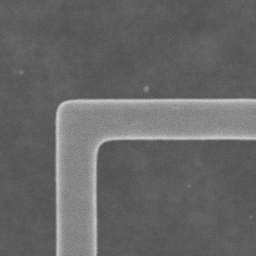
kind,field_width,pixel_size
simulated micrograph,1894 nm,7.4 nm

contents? wiring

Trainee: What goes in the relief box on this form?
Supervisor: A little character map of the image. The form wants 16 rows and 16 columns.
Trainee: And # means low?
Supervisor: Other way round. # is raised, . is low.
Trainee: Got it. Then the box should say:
................
................
................
................
................
................
....############
....############
....############
....##..........
....##..........
....##..........
....##..........
....##..........
....##..........
....##..........